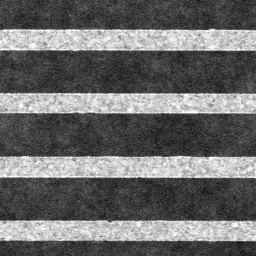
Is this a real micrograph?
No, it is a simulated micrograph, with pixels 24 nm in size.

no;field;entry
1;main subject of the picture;one or a few lines or trenches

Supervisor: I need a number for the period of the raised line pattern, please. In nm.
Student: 1530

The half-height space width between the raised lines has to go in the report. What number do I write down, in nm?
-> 1070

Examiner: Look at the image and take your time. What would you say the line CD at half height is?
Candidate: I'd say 456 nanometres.